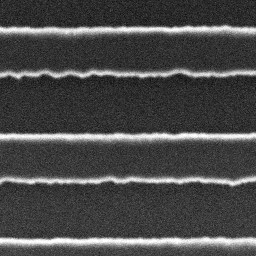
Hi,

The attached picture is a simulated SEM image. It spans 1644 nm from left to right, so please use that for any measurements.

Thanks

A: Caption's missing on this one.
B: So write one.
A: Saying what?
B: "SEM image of lines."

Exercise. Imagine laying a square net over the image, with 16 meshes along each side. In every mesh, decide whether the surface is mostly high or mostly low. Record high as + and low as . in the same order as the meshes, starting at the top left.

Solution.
................
................
++++++++++++++++
++++++++++++++++
++++++++++++++++
................
................
................
++++++++++++++++
++++++++++++++++
++++++++++++++++
................
................
................
................
++++++++++++++++